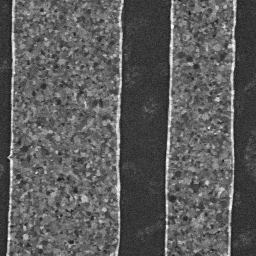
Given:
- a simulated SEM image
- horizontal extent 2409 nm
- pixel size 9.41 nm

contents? one or a few lines or trenches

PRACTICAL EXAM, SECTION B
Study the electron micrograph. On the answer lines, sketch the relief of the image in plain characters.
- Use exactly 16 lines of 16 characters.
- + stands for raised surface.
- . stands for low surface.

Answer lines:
.+++++++...++++.
.+++++++...++++.
.+++++++...++++.
.+++++++...++++.
.+++++++...++++.
.+++++++...++++.
.++++++....++++.
.++++++....+++..
.++++++....++++.
.++++++...+++++.
.++++++...+++++.
.++++++...+++++.
.++++++...++++..
.++++++...++++..
.++++++...++++..
+++++++...++++..